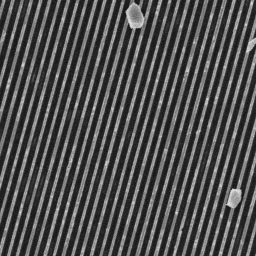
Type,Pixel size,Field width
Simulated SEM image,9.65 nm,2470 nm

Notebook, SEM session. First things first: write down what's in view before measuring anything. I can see parallel lines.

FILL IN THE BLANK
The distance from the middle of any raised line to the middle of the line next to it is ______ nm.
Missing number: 85.8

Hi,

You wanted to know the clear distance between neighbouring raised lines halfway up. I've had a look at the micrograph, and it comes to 0.0548 microns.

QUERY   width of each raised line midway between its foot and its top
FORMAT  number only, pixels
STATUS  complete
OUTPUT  2.78